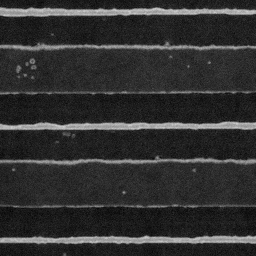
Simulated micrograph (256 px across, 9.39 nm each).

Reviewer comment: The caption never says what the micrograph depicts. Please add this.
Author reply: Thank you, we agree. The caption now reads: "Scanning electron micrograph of lines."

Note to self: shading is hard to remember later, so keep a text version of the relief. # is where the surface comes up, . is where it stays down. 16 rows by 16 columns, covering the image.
................
................
................
################
################
################
................
................
................
................
################
################
################
................
................
................